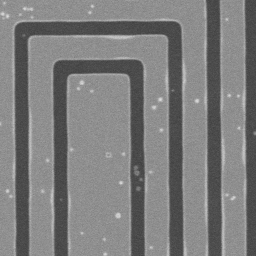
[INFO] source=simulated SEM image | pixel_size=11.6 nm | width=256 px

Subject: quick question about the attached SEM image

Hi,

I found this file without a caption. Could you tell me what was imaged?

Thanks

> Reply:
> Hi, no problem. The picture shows groups of lines, slits or small figures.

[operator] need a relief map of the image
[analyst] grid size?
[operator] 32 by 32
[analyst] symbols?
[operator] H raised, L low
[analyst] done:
HHHHHHHHHHHHHHHHHHHHHHHHHHLLHHLL
HHHHHHHHHHHHHHHHHHHHHHHHHHLLHHLL
HHHHHHHHHHHHHHHHHHHHHHHHHHLLHHHL
HHLLLLLLLLLLLLLLLLLLLLLHHHLLHHHL
HHLLLLLLLLLLLLLLLHHHHLLHHHLLHHHL
HHLLHHHHHHHHHHHHHHHHHLLHHHLLHHHL
HHLLHHHHHHHHHHHHHHHHHLLHHHLLHHHL
HHLLHHHHLLLLLLLLLHHHHLLHHHLLHHHL
HHLLHHHLLLLLLLLLLLHHHLLHHHLLHHHL
HHLLHHHLLHHHHHHHLLHHHLLHHHLLHHHL
HHLLHHHLLHHHHHHHLLHHHLLHHHLLHHHL
HHLLHHHLHHHHHHHHLLHHHLLHHHLLHHHL
HHLLHHHLHHHHHHHHLLHHHLLHHHLLHHLL
HHLLHHHLHHHHHHHHLLHHHLLHHHLLHHLL
HHLLHHHLHHHHHHHHLLHHHLLHHHLLHHHL
HHLLHHHLHHHHHHHHLLHHHLLHHHLLHHHL
HHLLHHHLHHHHHHHHLLHHHLLHHHLLHHLL
HHLLHHHLLHHHHHHHLLHHHLLHHHLLHHLL
HHLLHHHLLHHHHHHHLLHHHLLHHHLLHHLL
HHLLHHHLLHHHHHHHLLHHHLLHHHLLHHLL
HHLLHHHLLHHHHHHHLLHHHLLHHHLLHHHL
HHLLHHHLHHHHHHHHLLHHHLLHHHLLHHHL
HHLLHHHLHHHHHHHHLLHHHLLHHHLLHHHL
HHLLHHHLLHHHHHHHLLHHHLLHHHLLHHHL
HHLLHHHLLHHHHHHHLLHHHLLHHHLLHHHL
HHLLHHHLLHHHHHHHLLHHHLLHHHLLHHHL
HHLLHHHLLHHHHHHHLLHHHLLHHHLLHHHL
HHLLHHHLLHHHHHHHLLHHHLLHHHLLHHHL
HHLLHHHLLHHHHHHHLLHHHLLHHHLLHHHL
HHLLHHHLLHHHHHHHLLHHHLLHHHLLHHHL
HHLLHHHLLHHHHHHHLLHHHLLHHHLLHHHL
HHLLHHHLLHHHHHHHLLHHHLLHHHLLHHHL